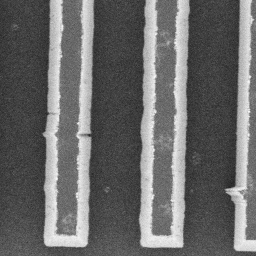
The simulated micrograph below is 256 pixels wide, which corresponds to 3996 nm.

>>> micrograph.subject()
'one or a few lines or trenches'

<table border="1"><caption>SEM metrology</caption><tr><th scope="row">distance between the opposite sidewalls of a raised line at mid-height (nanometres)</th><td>530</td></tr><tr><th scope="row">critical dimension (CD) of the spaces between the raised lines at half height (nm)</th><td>960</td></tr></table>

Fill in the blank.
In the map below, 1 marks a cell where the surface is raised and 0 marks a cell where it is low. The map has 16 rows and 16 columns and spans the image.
0001110001110001
0001110001100001
0001100001100001
0001100001100001
0001100001100001
0001100001100001
0001100001100001
0001100001100001
0001100001100001
0001100001100001
0001100001100001
0001100001100001
0001100001100001
0001100001100001
0001100001100001
0000000000000000